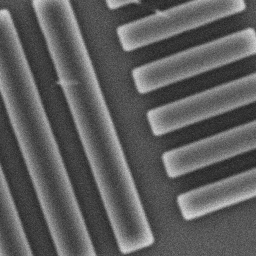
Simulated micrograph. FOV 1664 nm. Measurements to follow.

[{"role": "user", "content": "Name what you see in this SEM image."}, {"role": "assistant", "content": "groups of lines, slits or small figures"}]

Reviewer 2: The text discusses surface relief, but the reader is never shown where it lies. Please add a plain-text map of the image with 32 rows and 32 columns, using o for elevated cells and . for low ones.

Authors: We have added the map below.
....ooooo.....oo.......ooooooo..
o....oooo...........oooooooooo..
o....oooo........oooooooooo.....
oo...ooooo.....ooooooooo........
oo....oooo.....oooooo........ooo
ooo...oooo.....ooo........oooooo
ooo...ooooo............ooooooooo
ooo....oooo.........oooooooooo..
oooo...ooooo.....oooooooooo.....
oooo...ooooo.....ooooooo.......o
oooo....oooo.....oooo.......oooo
ooooo...ooooo.............oooooo
.oooo...ooooo..........ooooooooo
.oooo....oooo.......ooooooooo...
.ooooo...ooooo.....oooooooo.....
.ooooo....oooo.....ooooo.......o
..oooo....oooo.....oo.......oooo
..ooooo...ooooo..........ooooooo
...oooo....oooo........ooooooooo
...oooo....oooo......oooooooo...
...ooooo...ooooo.....ooooo......
....oooo....oooo.....ooo.......o
o...ooooo...ooooo...........oooo
o...ooooo...ooooo........ooooooo
o....oooo....oooo......ooooooooo
oo...ooooo...ooooo....ooooooo...
oo...ooooo...ooooo.....ooo......
oo....oooo....oooo..............
ooo...ooooo...ooooo.............
ooo....oooo....oooo.............
ooo....oooo....oooo.............
oooo...ooooo....................